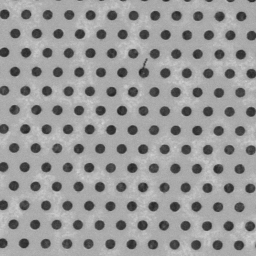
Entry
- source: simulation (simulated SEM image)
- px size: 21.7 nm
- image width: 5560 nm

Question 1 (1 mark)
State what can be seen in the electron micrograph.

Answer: a regular array of holes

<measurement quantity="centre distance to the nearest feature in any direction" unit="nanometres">463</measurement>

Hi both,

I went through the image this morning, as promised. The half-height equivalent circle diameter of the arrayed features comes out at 223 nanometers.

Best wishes